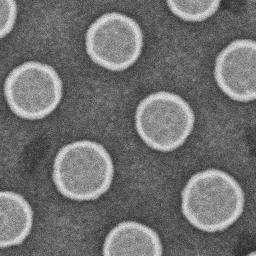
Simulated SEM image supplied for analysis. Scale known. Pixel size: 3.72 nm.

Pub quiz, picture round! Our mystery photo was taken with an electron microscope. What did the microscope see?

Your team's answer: raised bodies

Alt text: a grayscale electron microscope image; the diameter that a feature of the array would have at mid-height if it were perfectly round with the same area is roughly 201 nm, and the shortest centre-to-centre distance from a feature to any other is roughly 93.4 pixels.